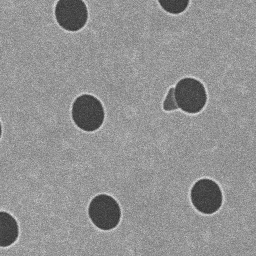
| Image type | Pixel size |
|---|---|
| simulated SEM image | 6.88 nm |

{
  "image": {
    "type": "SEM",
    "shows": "holes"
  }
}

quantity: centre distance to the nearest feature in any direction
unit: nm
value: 689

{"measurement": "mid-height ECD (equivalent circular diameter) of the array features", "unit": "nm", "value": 239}